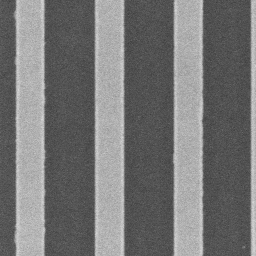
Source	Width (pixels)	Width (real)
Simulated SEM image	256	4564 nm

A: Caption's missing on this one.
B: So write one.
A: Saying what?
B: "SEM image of lines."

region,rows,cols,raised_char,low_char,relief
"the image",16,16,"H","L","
LHHLLLHHLLLHHLLL
LHHLLLHHLLLHHLLL
LHHLLLHHLLLHHLLL
LHHLLLHHLLLHHLLL
LHHLLLHHLLLHHLLL
LHHLLLHHLLLHHLLL
LHHLLLHHLLLHHLLL
LHHLLLHHLLLHHLLL
LHHLLLHHLLLHHLLL
LHHLLLHHLLLHHLLL
LHHLLLHHLLLHHLLL
LHHLLLHHLLLHHLLL
LHHLLLHHLLLHHLLL
LHHLLLHHLLLHHLLL
LHHLLLHHLLLHHLLL
LHHLLLHHLLLHHLLL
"